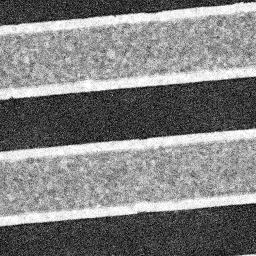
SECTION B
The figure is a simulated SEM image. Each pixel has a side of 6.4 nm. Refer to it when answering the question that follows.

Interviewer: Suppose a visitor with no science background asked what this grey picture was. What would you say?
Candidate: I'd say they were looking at one or a few lines or trenches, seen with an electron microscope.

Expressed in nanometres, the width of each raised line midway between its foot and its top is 404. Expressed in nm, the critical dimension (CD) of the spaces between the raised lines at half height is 398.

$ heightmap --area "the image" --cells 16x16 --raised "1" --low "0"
0000000000000001
0000011111111111
1111111111111111
1111111111111111
1111111111111111
1111000000000000
0000000000000000
0000000000000000
0000000000000011
0001111111111111
1111111111111111
1111111111111111
1111111111111100
1110000000000000
0000000000000000
0000000000000000